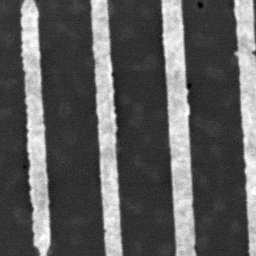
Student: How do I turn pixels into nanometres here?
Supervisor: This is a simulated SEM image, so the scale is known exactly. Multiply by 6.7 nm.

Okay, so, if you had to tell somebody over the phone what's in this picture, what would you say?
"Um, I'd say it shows one or a few lines or trenches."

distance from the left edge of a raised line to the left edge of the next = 478 nm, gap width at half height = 372 nanometres